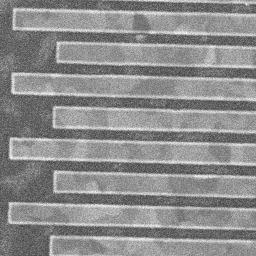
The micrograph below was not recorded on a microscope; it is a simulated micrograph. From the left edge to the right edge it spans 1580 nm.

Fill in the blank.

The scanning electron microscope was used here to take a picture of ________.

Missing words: parallel lines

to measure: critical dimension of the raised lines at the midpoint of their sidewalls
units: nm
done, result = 122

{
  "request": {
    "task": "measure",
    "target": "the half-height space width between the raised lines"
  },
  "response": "77.8 nanometres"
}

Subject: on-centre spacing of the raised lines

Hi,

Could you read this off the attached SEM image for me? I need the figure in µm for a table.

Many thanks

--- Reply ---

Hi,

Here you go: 0.199